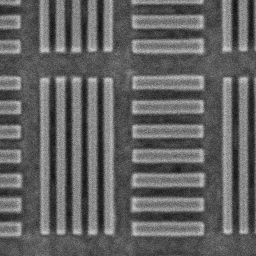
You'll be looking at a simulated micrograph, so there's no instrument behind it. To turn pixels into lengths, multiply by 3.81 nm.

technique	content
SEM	groups of lines, slits or small figures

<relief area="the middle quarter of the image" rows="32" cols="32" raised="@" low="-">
--------------------------------
--------------------------------
--------------------------------
-----------------@@@@@@@@@@@@@@@
--@@--@@--@@-----@@@@@@@@@@@@@@@
--@@--@@--@@-----@@@@@@@@@@@@@@@
--@@--@@--@@--------------------
--@@--@@--@@--------------------
--@@--@@--@@--------------------
--@@--@@--@@-----@@@@@@@@@@@@@@@
--@@--@@--@@-----@@@@@@@@@@@@@@@
--@@--@@--@@-----@@@@@@@@@@@@@@@
--@@--@@--@@--------------------
--@@--@@--@@--------------------
--@@--@@--@@--------------------
--@@--@@--@@-----@@@@@@@@@@@@@@@
--@@--@@--@@-----@@@@@@@@@@@@@@@
--@@--@@--@@-----@@@@@@@@@@@@@@@
--@@--@@--@@--------------------
--@@--@@--@@--------------------
--@@--@@--@@--------------------
--@@--@@--@@-----@@@@@@@@@@@@@@@
--@@--@@--@@-----@@@@@@@@@@@@@@@
--@@--@@--@@-----@@@@@@@@@@@@@@@
--@@--@@--@@--------------------
--@@--@@--@@--------------------
--@@--@@--@@--------------------
--@@--@@--@@--------------------
--@@--@@--@@-----@@@@@@@@@@@@@@@
--@@--@@--@@-----@@@@@@@@@@@@@@@
--@@--@@--@@--------------------
--@@--@@--@@--------------------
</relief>